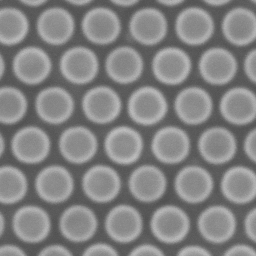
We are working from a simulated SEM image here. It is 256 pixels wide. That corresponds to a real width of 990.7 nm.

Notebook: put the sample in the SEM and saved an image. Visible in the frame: a regular array of raised bodies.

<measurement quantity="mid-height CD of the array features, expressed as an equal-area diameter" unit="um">0.132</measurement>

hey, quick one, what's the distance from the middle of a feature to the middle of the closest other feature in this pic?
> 176 nm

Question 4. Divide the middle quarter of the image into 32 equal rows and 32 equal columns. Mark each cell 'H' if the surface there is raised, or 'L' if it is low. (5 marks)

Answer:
HHHHHHHHLLLHHHHHHHHLLLLHHHHHHHHL
HHHHHHHHLLLHHHHHHHHLLLLHHHHHHHHL
HHHHHHHLLLLHHHHHHHHLLLLHHHHHHHLL
LHHHHHHLLLLLHHHHHHLLLLLLHHHHHHLL
LLLHLLLLLLLLLLLLLLLLLLLLLLHHLLLL
LLLLLLLLLLLLLLLLLLLLLLLLLLLLLLLL
LLLLLLLLHHHLLLLLLLLLHHLLLLLLLLLH
LLLLLLHHHHHHLLLLLLHHHHHHLLLLLHHH
HLLLLHHHHHHHHLLLLHHHHHHHLLLLLHHH
HHLLLHHHHHHHHHLLLHHHHHHHHLLLHHHH
HHLLLHHHHHHHHHLLLHHHHHHHHLLLHHHH
HHLLLHHHHHHHHHLLLHHHHHHHHLLLHHHH
HLLLLLHHHHHHHLLLLHHHHHHHHLLLLHHH
LLLLLLHHHHHHLLLLLHHHHHHHLLLLLHHH
LLLLLLLLLLLLLLLLLLLHHHLLLLLLLLLH
LLLLLLLLLLLLLLLLLLLLLLLLLLLLLLLL
LLHHHLLLLLLLLLHHLLLLLLLLLHHHLLLL
HHHHHHHLLLLLHHHHHHLLLLLLHHHHHHLL
HHHHHHHLLLLHHHHHHHHLLLLHHHHHHHHL
HHHHHHHHLLLHHHHHHHHLLLLHHHHHHHHL
HHHHHHHHLLLHHHHHHHHLLLHHHHHHHHHL
HHHHHHHHLLLHHHHHHHHLLLLHHHHHHHHL
HHHHHHHLLLLHHHHHHHHLLLLHHHHHHHLL
LHHHHHLLLLLLHHHHHHLLLLLLHHHHHHLL
LLLLLLLLLLLLLLHHLLLLLLLLLLLLLLLL
LLLLLLLLLLLLLLLLLLLLLLLLLLLLLLLL
LLLLLLLHHHHHLLLLLLLHHHHLLLLLLLHH
HLLLLLHHHHHHHLLLLLHHHHHHLLLLLHHH
HLLLLHHHHHHHHLLLLHHHHHHHHLLLLHHH
HHLLLHHHHHHHHHLLLHHHHHHHHLLLHHHH
HHLLLHHHHHHHHLLLLHHHHHHHHLLLHHHH
HHLLLHHHHHHHHLLLLHHHHHHHHLLLHHHH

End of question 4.